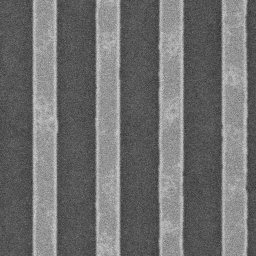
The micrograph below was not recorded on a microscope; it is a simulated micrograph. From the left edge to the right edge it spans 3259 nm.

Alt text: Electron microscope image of one or a few lines or trenches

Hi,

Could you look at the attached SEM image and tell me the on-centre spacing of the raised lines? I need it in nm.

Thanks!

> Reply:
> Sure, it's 806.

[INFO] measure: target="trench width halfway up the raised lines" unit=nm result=538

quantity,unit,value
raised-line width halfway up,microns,0.269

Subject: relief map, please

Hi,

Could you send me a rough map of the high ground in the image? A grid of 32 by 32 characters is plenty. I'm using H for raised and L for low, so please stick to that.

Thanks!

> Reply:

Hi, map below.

LLLLHHHLLLLLHHHLLLLLHHHLLLLLHHHL
LLLLHHHLLLLLHHHLLLLLHHHLLLLLHHHL
LLLLHHHLLLLLHHHLLLLLHHHLLLLLHHHL
LLLLHHHLLLLLHHHLLLLLHHHLLLLLHHHL
LLLLHHHLLLLLHHHLLLLLHHHLLLLLHHHL
LLLLHHHLLLLLHHHLLLLLHHHLLLLLHHHL
LLLLHHHLLLLLHHHLLLLLHHHLLLLLHHHL
LLLLHHHLLLLLHHHLLLLLHHHLLLLLHHHL
LLLLHHHLLLLLHHHLLLLLHHHLLLLLHHHL
LLLLHHHLLLLLHHHLLLLLHHHLLLLLHHHL
LLLLHHHLLLLLHHHLLLLLHHHLLLLLHHHL
LLLLHHHLLLLLHHHLLLLLHHHLLLLLHHHL
LLLLHHHLLLLLHHHLLLLLHHHLLLLLHHHL
LLLLHHHLLLLLHHHLLLLLHHHLLLLLHHHL
LLLLHHHLLLLLHHHLLLLLHHHLLLLLHHHL
LLLLHHHLLLLLHHHLLLLLHHHLLLLLHHHL
LLLLHHHLLLLLHHHLLLLLHHHLLLLLHHHL
LLLLHHHLLLLLHHHLLLLLHHHLLLLLHHHL
LLLLHHHLLLLLHHHLLLLLHHHLLLLLHHHL
LLLLHHHLLLLLHHHLLLLLHHHLLLLLHHHL
LLLLHHHLLLLLHHHLLLLLHHHLLLLLHHHL
LLLLHHHLLLLLHHHLLLLLHHHLLLLLHHHL
LLLLHHHLLLLLHHHLLLLLHHHLLLLLHHHL
LLLLHHHLLLLLHHHLLLLLHHHLLLLLHHHL
LLLLHHHLLLLLHHHLLLLLHHHLLLLLHHHL
LLLLHHHLLLLLHHHLLLLLHHHLLLLLHHHL
LLLLHHHLLLLLHHHLLLLLHHHLLLLLHHHL
LLLLHHHLLLLLHHHLLLLLHHHLLLLLHHHL
LLLLHHHLLLLLHHHLLLLLHHHLLLLLHHHL
LLLLHHHLLLLLHHHLLLLLHHHLLLLLHHHL
LLLLHHHLLLLLHHHLLLLLHHHLLLLLHHHL
LLLLHHHLLLLLHHHLLLLLHHHLLLLLHHHL